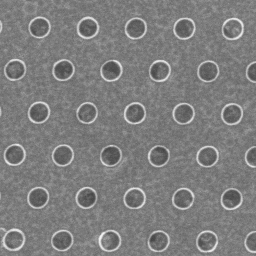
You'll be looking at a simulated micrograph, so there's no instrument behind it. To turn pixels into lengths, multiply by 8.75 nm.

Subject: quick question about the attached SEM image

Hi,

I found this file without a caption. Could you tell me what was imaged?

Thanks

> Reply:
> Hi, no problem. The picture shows a regular array of raised bodies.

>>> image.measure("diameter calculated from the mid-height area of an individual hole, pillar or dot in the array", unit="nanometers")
180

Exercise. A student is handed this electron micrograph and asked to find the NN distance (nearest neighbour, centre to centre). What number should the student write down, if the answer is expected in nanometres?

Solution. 421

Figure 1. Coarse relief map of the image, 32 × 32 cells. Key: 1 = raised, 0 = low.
00000000000000000000000000000000
00000000000000000000000000000000
00001100001100001100001100000100
00001100001100001100001100001100
00001100001100001100001100001100
00000000000000000000000000000000
00000000000000000000000000000000
00000000000000000000000000000000
01100001100001100001100001100001
01100001100001100001100001100001
00000000000000000000000000000000
00000000000000000000000000000000
00000000000000000000000000000000
00001100001100001100001100001100
00001100001100001100001100001100
00000000000000000000000000000000
00000000000000000000000000000000
00000000000000000000000000000000
01100001100001100001100001100000
01100001100001100001100001100001
01000001000001000001100001100001
00000000000000000000000000000000
00000000000000000000000000000000
00000000000000000000000000000000
00001100001100001100001100001100
00001100001100001100001100001100
00000000000000000000000000000000
00000000000000000000000000000000
00000000000000000000000000000000
11100001100001100001100001100001
11100001100001100001100001100001
00000000000000000000000000000000